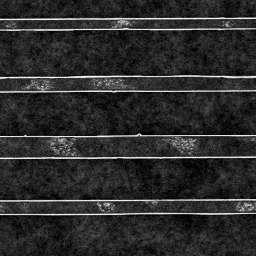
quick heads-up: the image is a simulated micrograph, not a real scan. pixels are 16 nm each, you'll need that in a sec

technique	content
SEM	one or a few lines or trenches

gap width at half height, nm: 710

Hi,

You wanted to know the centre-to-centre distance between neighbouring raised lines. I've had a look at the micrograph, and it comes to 979 nm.